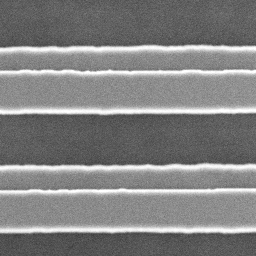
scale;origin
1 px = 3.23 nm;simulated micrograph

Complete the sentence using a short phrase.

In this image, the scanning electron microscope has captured lines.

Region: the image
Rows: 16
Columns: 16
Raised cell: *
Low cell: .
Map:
................
................
................
****************
****************
****************
****************
................
................
................
****************
****************
****************
****************
................
................